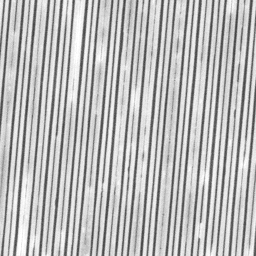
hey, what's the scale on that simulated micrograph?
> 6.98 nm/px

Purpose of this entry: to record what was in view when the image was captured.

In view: parallel lines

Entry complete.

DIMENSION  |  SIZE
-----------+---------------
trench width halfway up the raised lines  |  2.74 px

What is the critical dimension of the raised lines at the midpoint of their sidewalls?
26.1 nanometres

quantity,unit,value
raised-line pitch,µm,0.0441